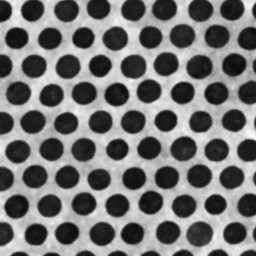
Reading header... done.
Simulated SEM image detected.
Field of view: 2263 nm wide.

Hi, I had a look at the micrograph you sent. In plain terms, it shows a regular array of holes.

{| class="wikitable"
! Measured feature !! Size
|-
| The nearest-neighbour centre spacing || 277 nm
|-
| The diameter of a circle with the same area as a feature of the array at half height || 212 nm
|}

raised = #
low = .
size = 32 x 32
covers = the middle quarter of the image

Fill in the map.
....##......##.......#.......##.
....##......##.......##.....###.
...####....####.....###....####.
..##############...#############
####..#############....######..#
###.....###....###......###.....
##......##......##......###.....
##......##......##......###.....
##......##......###.....###.....
###....####.....####...#####...#
############..##################
#########.#######.#######.######
..#####....####.....###.....####
...###......##......###.....####
....##......##.......##.....###.
...###......##......###.....###.
...####....####....#####...#####
..#######.######..##############
####..##############...#####....
###....####.....###.....###.....
##......###.....##......###.....
##......##......##......##......
##......###.....###.....###.....
###....#####...#####...####.....
####.###########################
..##############################
...####...######....###.....###.
....##.....####.....###......##.
....##......##.......##......##.
....##......##......###......##.
...###.....####.....###.....####
#######...#######.##############